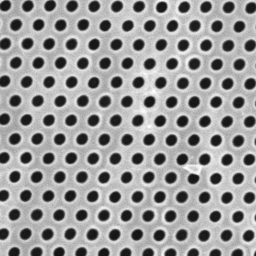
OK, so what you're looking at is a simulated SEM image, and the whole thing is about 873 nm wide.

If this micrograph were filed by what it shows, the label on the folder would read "a regular array of holes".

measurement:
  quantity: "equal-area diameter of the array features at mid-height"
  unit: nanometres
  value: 37.9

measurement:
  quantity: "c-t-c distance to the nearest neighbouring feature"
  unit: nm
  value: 74.2